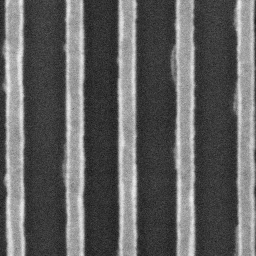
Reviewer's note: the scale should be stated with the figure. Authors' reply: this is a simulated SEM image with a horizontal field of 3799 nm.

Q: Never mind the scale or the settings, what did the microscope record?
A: lines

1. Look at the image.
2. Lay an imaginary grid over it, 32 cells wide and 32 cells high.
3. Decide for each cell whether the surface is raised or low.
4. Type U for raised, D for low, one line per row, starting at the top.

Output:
DUUDDDDDUUDDDDDUUDDDDDUUDDDDDDUU
DUUDDDDDUUDDDDDUUDDDDDUUDDDDDDUU
DUUDDDDDUUDDDDDUUDDDDDUUDDDDDDUU
DUUDDDDDUUDDDDDUUDDDDDUUDDDDDDUU
DUUDDDDDUUDDDDDUUDDDDDUUDDDDDDUU
DUUDDDDDUUDDDDDUUDDDDDUUDDDDDDUU
DUUDDDDDUUDDDDDUUDDDDDUUDDDDDDUU
DUUDDDDDUUDDDDDUUDDDDDUUDDDDDDUU
DUUDDDDDUUDDDDDUUDDDDDUUDDDDDDUU
DUUDDDDDUUDDDDDUUDDDDDUUDDDDDDUU
DUUDDDDDUUDDDDDUUDDDDDUUDDDDDDUU
DUUDDDDDUUDDDDDUUDDDDDUUDDDDDDUU
DUUDDDDDUUDDDDDUUDDDDDUUDDDDDDUU
DUUDDDDDUUDDDDDUUDDDDDUUDDDDDDUU
DUUDDDDDUUDDDDDUUDDDDDUUDDDDDDUU
DUUDDDDDUUDDDDDUUDDDDDUUDDDDDDUU
DUUDDDDDUUDDDDDUUDDDDDUUDDDDDDUU
DUUDDDDDUUDDDDDUUDDDDDUUDDDDDDUU
DUUDDDDDUUDDDDDUUDDDDDUUDDDDDDUU
DUUDDDDDUUDDDDDUUDDDDDUUDDDDDDUU
DUUDDDDDUUDDDDDUUDDDDDUUDDDDDDUU
DUUDDDDDUUDDDDDUUDDDDDUUDDDDDDUU
DUUDDDDDUUDDDDDUUDDDDDUUDDDDDDUU
DUUDDDDDUUDDDDDUUDDDDDUUDDDDDDUU
DUUDDDDDUUDDDDDUUDDDDDUUDDDDDDUU
DUUDDDDDUUDDDDDUUDDDDDUUDDDDDDUU
DUUDDDDDUUDDDDDUUDDDDDUUDDDDDDUU
DUUDDDDDUUDDDDDUUDDDDDUUDDDDDDUU
DUUDDDDDUUDDDDDUUDDDDDUUDDDDDDUU
DUUDDDDDUUDDDDDUUDDDDDUUDDDDDDUU
DUUDDDDDUUDDDDDUUDDDDDUUDDDDDDUU
DUUDDDDDUUDDDDDUUDDDDDUUDDDDDDUU